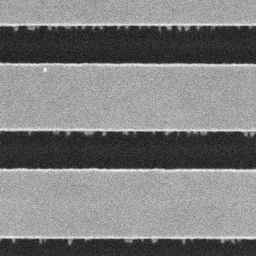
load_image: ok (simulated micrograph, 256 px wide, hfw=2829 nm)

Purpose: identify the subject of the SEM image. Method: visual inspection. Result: lines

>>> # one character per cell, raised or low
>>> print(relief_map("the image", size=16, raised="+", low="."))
++++++++++++++++
++++++++++++++++
................
................
++++++++++++++++
++++++++++++++++
++++++++++++++++
++++++++++++++++
................
................
................
++++++++++++++++
++++++++++++++++
++++++++++++++++
++++++++++++++++
................